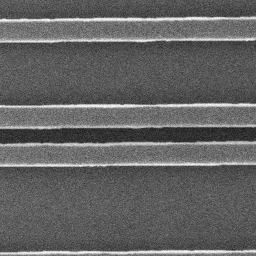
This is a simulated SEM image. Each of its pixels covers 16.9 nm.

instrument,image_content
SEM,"lines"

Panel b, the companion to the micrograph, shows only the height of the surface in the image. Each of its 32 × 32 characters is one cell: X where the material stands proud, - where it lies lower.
--------------------------------
--------------------------------
----XXXXXXXXXXXXXXXXXXXXXXXXXXXX
XXXXXXXXXXXXXXXXXXXXXXXXXXXXXXXX
XXXXXXXXXXXXXXXXXXXXXXXXXXXXXXXX
--------------------------------
--------------------------------
--------------------------------
--------------------------------
--------------------------------
--------------------------------
--------------------------------
--------------------------------
XXXXXXXXXXXXXXXXXXXXXXXXXXXXXXXX
XXXXXXXXXXXXXXXXXXXXXXXXXXXXXXXX
XXXXXXXXXXXXXXXXXXXXXXXXXXXXXXXX
--------------------------------
--------------------------------
XXXXXXXXXXXXXXXXXXXXXXXXXXXXXXXX
XXXXXXXXXXXXXXXXXXXXXXXXXXXXXXXX
XXXXXXXXXXXXXXXXXXXXXXXXXXX-----
--------------------------------
--------------------------------
--------------------------------
--------------------------------
--------------------------------
--------------------------------
--------------------------------
--------------------------------
--------------------------------
--------------------------------
----------------------------XXXX